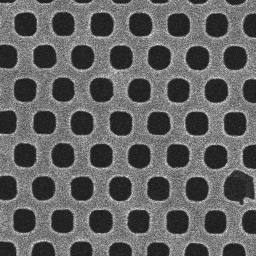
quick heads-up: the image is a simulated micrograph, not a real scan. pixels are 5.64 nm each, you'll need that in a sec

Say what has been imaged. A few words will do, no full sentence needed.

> a regular array of holes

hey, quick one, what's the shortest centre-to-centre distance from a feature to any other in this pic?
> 212 nm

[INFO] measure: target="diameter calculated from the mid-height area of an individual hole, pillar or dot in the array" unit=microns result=0.14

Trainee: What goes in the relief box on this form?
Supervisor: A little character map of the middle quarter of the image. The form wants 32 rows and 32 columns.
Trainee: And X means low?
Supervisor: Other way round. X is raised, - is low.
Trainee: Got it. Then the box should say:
XX-----XXXXX-----XXXX-----XXXXX-
XXXXXXXXXXXXXX-XXXXXXXXXXXXXXXXX
XXXXXXXXXXXXXXXXXXXXXXXXXXXXXXXX
-XXXXXXX--XXXXXXXXXXXXXXXXXX-XXX
--XXXXX-----XXXXX----XXXXX-----X
---XXX------XXXX------XXXX------
---XXX------XXXX------XXXX------
---XXXX-----XXXX------XXXX------
--XXXXX-----XXXX------XXXX-----X
XXXXXXXXX-XXXXXXX----XXXXXX---XX
XXXXXXXXXXXXXXXXXXXXXXXXXXXXXXXX
XXXXXXXXXXXXXXXXXXXXXXXXXXXXXXXX
XX----XXXXXX----XXXXX-----XXXXX-
XX-----XXXX------XXXX-----XXXX--
XX------XXX------XXXX------XXX--
XX------XXX------XXXX------XXX--
XX-----XXXXX-----XXXX-----XXXXX-
XXX---XXXXXXX---XXXXXX---XXXXXX-
XXXXXXXXXXXXXXXXXXXXXXXXXXXXXXXX
XXXXXXXXXXXXXXXXXXXXXXXXXXXXXXXX
--XXXXX----XXXXXX----XXXXX----XX
--XXXXX-----XXXX------XXXX-----X
---XXX------XXXX------XXXX-----X
---XXX------XXXX------XXXX-----X
--XXXXX-----XXXX-----XXXXX-----X
--XXXXX----XXXXXX----XXXXX----XX
XXXXXXXXXXXXXXXXXXXXXXXXXXXXXXXX
XXXXXXXXXXXXXXXXXXXXXXXXXXXXXXXX
XXX---XXXXXX----XXXXXX---XXXXXXX
XX-----XXXX------XXXX-----XXXXX-
X------XXXX------XXXX------XXXX-
XX-----XXXX------XXXX------XXX--